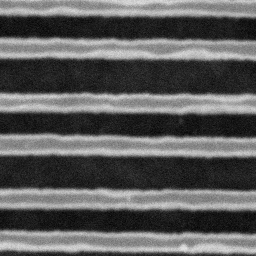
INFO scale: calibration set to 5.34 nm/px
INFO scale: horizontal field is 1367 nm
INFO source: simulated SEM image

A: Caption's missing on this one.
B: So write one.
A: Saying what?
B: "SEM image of lines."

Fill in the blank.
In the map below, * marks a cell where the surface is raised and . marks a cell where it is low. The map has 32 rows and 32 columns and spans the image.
********************************
********************************
................................
................................
................................
********************************
********************************
................................
................................
................................
................................
................................
********************************
********************************
................................
................................
................................
********************************
********************************
................................
................................
................................
................................
................................
********************************
********************************
................................
................................
................................
********************************
********************************
................................